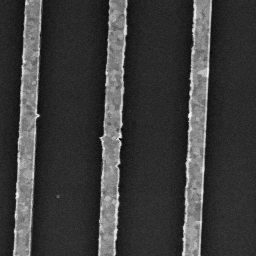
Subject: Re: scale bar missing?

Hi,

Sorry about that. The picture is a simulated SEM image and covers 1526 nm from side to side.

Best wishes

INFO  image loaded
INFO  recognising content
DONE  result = one or a few lines or trenches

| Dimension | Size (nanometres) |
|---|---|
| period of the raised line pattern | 505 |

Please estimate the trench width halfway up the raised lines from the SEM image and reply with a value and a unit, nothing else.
409 nanometres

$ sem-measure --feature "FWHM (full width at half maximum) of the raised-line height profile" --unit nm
95.3